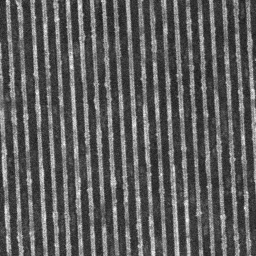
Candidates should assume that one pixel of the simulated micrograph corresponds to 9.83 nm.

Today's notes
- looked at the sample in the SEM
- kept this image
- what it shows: parallel lines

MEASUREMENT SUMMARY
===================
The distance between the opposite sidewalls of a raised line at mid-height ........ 33.1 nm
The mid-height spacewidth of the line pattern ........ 82.2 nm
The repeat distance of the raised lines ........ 118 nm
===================